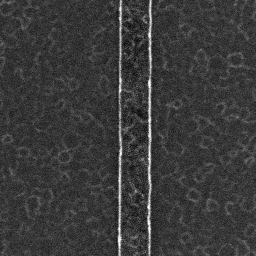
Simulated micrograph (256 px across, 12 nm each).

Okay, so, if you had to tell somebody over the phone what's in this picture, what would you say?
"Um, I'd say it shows one or a few lines or trenches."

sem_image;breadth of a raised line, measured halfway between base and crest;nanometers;365